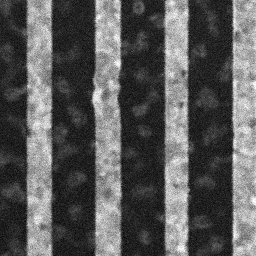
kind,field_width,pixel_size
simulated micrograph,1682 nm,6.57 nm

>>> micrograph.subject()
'one or a few lines or trenches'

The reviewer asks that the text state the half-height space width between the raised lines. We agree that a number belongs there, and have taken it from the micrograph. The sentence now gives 302 nm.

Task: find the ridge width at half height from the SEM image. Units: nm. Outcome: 151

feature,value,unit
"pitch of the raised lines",450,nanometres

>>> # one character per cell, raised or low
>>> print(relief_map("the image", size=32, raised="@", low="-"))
----@@------@@@--@---@@------@@@
----@@------@@@------@@------@@@
----@@------@@@------@@------@@@
---@@@------@@@------@@------@@@
---@@@------@@@------@@------@@@
----@@------@@@------@@------@@@
----@@------@@@------@@------@@@
----@@------@@@------@@------@@@
----@@------@@@------@@------@@@
----@@------@@@------@@------@@@
---@@@------@@@------@@------@@@
---@@@------@@@------@@------@@@
----@@------@@@------@@------@@@
----@@------@@@------@@------@@@
----@@------@@@------@@------@@@
----@@------@@@------@@------@@@
----@@------@@@------@@------@@@
----@@------@@@------@@------@@@
----@@------@@@------@@------@@@
----@@------@@@------@@------@@@
----@@------@@@------@@------@@@
----@@------@@@------@@------@@@
----@@------@@@------@@------@@@
----@@------@@@------@@------@@@
----@@------@@@------@@------@@@
----@@------@@@------@@------@@@
----@@------@@@------@@------@@@
----@@------@@@------@@------@@@
----@@------@@@------@@------@@@
----@@------@@@------@@------@@@
----@@------@@@------@@------@@@
----@@------@@@------@@------@@@